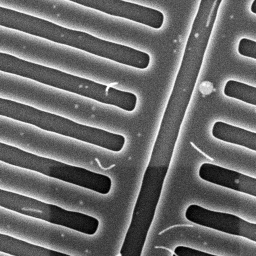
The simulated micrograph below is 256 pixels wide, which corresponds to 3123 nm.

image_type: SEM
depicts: groups of lines, slits or small figures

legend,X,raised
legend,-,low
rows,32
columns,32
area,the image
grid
XXXXXXXXXX-------XXXXXXXX---XXXX
--XXXXXXXXXXX-------XXXXX--XXXXX
------XXXXXXXXXX----XXXX---XXXXX
X-------XXXXXXXXXXX-XXXX---XXXXX
XXXXX-------XXXXXXXXXXXX--XXXXXX
XXXXXXXX-------XXXXXXXX---XXXX--
XXXXXXXXXXX-------XXXXX---XXXX--
---XXXXXXXXXXX-----XXXX--XXXXXXX
-------XXXXXXXXXX-XXXX---XXXXXXX
XX--------XXXXXXXXXXXX---XXXXXXX
XXXXX--------XXXXXXXXX--XXXX---X
XXXXXXXXX-------XXXXX---XXXX----
-XXXXXXXXXXX-----XXXX---XXXXXX--
----XXXXXXXXXXX--XXXX--XXXXXXXXX
--------XXXXXXXXXXXX---XXXXXXXXX
XXXX------XXXXXXXXXX---XXXX--XXX
XXXXXX--------XXXXXX--XXXXX-----
XXXXXXXXXX------XXX---XXXXXX----
--XXXXXXXXXXX--XXXX---XXXXXXXXX-
-----XXXXXXXXXXXXXX---XXXXXXXXXX
X-------XXXXXXXXXXX--XXXX--XXXXX
XXXXX-------XXXXXX---XXXX-----XX
XXXXXXXX------XXXX---XXXXX------
XXXXXXXXXXX---XXX---XXXXXXXXX---
---XXXXXXXXXXXXXX---XXXXXXXXXXXX
------XXXXXXXXXXX---XXXXXXXXXXXX
XX--------XXXXXXX--XXXX----XXXXX
XXXXX-------XXXX---XXXXX-------X
XXXXXXXXX---XXXX---XXXXXXX------
-XXXXXXXXXXXXXXX--XXXXXXXXXXXX--
----XXXXXXXXXXX---XXXXXXXXXXXXXX
-------XXXXXXXX---XXXX----XXXXXX